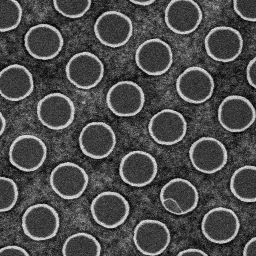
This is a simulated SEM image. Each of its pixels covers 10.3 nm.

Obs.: a regular array of raised bodies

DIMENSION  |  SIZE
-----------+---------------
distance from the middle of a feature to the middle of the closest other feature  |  510 nm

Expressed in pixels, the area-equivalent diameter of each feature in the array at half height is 34.7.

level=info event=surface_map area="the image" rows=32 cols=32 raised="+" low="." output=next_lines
++.....++++..........+++.....+++
+++.....+++..........++++.....++
++..........++++.....++++.......
+...+++.....++++.....+++...+....
...++++.....++++..........++++..
...+++++.....++...+++.....++++..
....+++..........++++.....++++..
.........+++.....++++.......+...
.++.....+++++.....+++..........+
++++.....++++..........+++.....+
++++.....+++...++.....+++++....+
++++..........++++....++++......
.....++++....+++++......++..+++.
.....++++.....++++.........+++++
.....++++..........++++....+++++
......++...++......++++.....+++.
..........++++.....++++.........
..+++.....++++.....+++...++.....
.+++++....++++..........++++....
.+++++.....++...+++.....++++....
..+++...+......++++.....++++....
.......+++.....++++.......+...++
+.....+++++.....+++...+......+++
++.....++++.........++++.....+++
++......++..+++.....+++++.....++
++..........++++......++........
...++++.....++++..........+++...
...++++.....+++..........+++++..
...++++..........++++....+++++..
....++...++......++++.....+++...
........++++.....++++..........+
+++.....++++......++...++......+